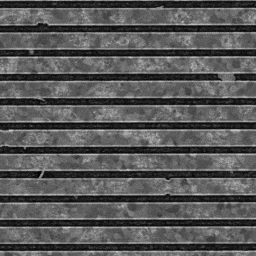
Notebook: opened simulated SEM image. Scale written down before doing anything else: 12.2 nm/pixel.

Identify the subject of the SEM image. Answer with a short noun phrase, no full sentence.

parallel lines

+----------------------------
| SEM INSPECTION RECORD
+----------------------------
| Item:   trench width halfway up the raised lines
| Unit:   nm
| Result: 94.4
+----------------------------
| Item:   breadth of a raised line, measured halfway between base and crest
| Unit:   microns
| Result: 0.2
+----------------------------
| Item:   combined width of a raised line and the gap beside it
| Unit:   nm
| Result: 296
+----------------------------